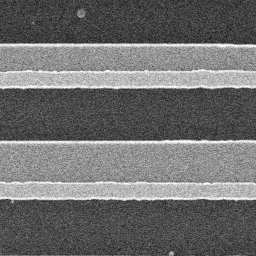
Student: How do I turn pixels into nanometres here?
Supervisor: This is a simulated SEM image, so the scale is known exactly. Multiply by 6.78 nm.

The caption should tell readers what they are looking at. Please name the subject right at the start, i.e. lines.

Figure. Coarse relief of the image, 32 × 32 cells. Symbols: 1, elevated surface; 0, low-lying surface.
00000000000000000000000000000000
00000000000000000000000000000000
00000000000000000000000000000000
00000000000000000000000000000000
00000000000000000000000000000000
00000000000000000000000000000000
11111111111111111111111111111111
11111111111111111111111111111111
11111111111111111111111111111111
11111111111111111111111111111111
11111111111111111111111111111111
00000000000000000000000000000000
00000000000000000000000000000000
00000000000000000000000000000000
00000000000000000000000000000000
00000000000000000000000000000000
00000000000000000000000000000000
00000000000000000000000000000000
11111111111111111111111111111111
11111111111111111111111111111111
11111111111111111111111111111111
11111111111111111111111111111111
11111111111111111111111111111111
11111111111111111111111111111111
11111111111111111111111111111111
00000000000000000000000000000000
00000000000000000000000000000000
00000000000000000000000000000000
00000000000000000000000000000000
00000000000000000000000000000000
00000000000000000000000000000000
00000000000000000000000000000000